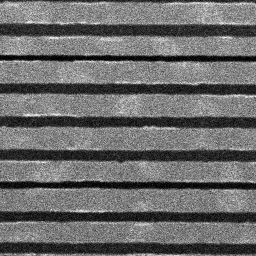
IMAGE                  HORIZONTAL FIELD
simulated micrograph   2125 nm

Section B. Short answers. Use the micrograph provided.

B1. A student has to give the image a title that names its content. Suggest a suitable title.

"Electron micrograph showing parallel lines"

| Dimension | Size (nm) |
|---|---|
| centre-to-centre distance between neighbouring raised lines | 260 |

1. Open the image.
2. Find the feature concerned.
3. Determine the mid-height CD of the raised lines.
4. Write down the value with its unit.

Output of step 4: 184 nm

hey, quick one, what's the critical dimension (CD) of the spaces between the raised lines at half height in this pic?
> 92.3 nm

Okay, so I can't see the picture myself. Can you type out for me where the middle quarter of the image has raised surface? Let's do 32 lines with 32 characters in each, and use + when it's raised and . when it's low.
++++++++++++++++++++++++++++++++
++++++++++++++++++++++++++++++++
++++++++++++++++++++++++++++++++
++++++++++++++++++++++++++++++++
++++++++++++++++++++++++++++++++
................................
................................
................................
++++++++++++++++++++++++++++++++
++++++++++++++++++++++++++++++++
++++++++++++++++++++++++++++++++
++++++++++++++++++++++++++++++++
++++++++++++++++++++++++++++++++
................................
................................
................................
++++++++++++++++++++++++++++++++
++++++++++++++++++++++++++++++++
++++++++++++++++++++++++++++++++
++++++++++++++++++++++++++++++++
++++++++++++++++++++++++++++++++
........++.....++++++......+++..
................................
................................
+++++.++..+++..+++++++....++++++
++++++++++++++++++++++++++++++++
++++++++++++++++++++++++++++++++
++++++++++++++++++++++++++++++++
++++++++++++++++++++++++++++++++
............................+.+.
................................
++++++++++++++++++++++++++++++++